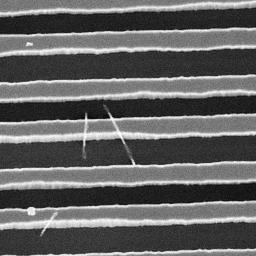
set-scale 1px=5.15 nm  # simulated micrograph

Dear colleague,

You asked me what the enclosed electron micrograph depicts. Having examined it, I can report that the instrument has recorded lines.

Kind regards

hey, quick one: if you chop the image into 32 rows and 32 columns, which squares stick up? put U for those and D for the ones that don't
UUUUUUUUUUUUUUUUUUUUUUUUUUUUUUUU
UUUUUDDDDDDDDDDDDDDDDDDDDDDDDDDD
DDDDDDDDDDDDDDDDDDDDDDDDDDDDDDDD
DDDDDDDDDDDDDDDDDDDDDDDDDDDDDDDD
UUUUUUUUUUUUUUUUUUUUUUUUUUUUUUUU
UUUUUUUUUUUUUUUUUUUUUUUUUUUUUUUU
UUUUUUDDDDDDDDDDDDDDDDDDDDDDDDDD
DDDDDDDDDDDDDDDDDDDDDDDDDDDDDDDD
DDDDDDDDDDDDDDDDDDDDDDDDDDDDDDDD
DDDDDDDDDDDDDDDDDDDDDDDDDDDDUUUU
UUUUUUUUUUUUUUUUUUUUUUUUUUUUUUUU
UUUUUUUUUUUUUUUUUUUUUUUUUUUUUUUU
UUUUDDDDDDDDDDDDDDDDDDDDDDDDDDDD
DDDDDDDDDDDDDDDDDDDDDDDDDDDDDDDD
DDDDDDDDDDDDDDDDDDDDDDDDDDUUUUUU
UUUUUUUUUUUUUUUUUUUUUUUUUUUUUUUU
UUUUUUUUUUUUUUUUUUUUUUUUUUUUUUUU
DDDDDDDDDDDDDDDDDDDDDDDDDDDDDDDD
DDDDDDDDDDDDDDDDDDDDDDDDDDDDDDDD
DDDDDDDDDDDDDDDDDDDDDDDDDDDDDDDD
DDDDDDDDDDDDDDDDDDDDDDUUUUUUUUUU
UUUUUUUUUUUUUUUUUUUUUUUUUUUUUUUU
UUUUUUUUUUUUUUUUUUUUUUUUUUUUUUUU
DDDDDDDDDDDDDDDDDDDDDDDDDDDDDDDD
DDDDDDDDDDDDDDDDDDDDDDDDDDDDDDDD
DDDDDDDDDDDDDDDDDDDDDDUUUUUUUUUU
UUUUUUUUUUUUUUUUUUUUUUUUUUUUUUUU
UUUUUUUUUUUUUUUUUUUUUUUUUUUUUUUU
DDDDDDDDDDDDDDDDDDDDDDDDDDDDDDDD
DDDDDDDDDDDDDDDDDDDDDDDDDDDDDDDD
DDDDDDDDDDDDDDDDDDDDDDDDDDDDDDDD
DDDDDDDDDDDDDDDDDDDDUUUUUUUUUUUU